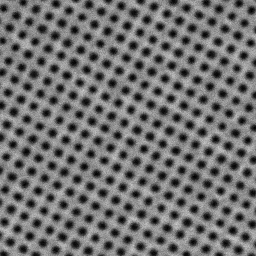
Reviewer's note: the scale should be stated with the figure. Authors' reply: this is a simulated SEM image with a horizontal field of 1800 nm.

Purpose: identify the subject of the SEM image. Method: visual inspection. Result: a regular array of holes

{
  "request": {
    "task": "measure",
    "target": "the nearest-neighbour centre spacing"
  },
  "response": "0.1 microns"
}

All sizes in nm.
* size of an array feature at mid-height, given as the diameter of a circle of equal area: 58.8